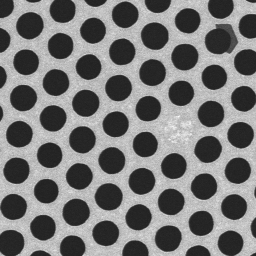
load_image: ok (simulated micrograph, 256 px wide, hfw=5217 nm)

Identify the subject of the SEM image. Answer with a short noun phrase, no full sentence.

a regular array of holes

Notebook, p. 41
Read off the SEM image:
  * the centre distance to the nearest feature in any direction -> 731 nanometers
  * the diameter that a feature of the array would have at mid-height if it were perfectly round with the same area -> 541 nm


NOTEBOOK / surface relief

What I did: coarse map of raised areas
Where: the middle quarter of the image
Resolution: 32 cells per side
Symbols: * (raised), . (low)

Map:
***......**********......***....
***......**********......****..*
***......**********......*******
.***....***.....***......*******
.**********......**......***...*
.*********.......****.*****.....
.****.****.......*********......
***.....***......*********......
**.......**.....***....***......
**.......*********......***.....
**.......*********......****.***
**......**********......********
.**.....***....***......********
.*********......***....*********
**********......****************
**********......****************
**.....***......****************
**......***....***....**********
*.......**********.....*********
*.......*********......*********
**.....**********......*********
**.....***....***......*********
*********......***.....****..***
*********......**********.....**
*********......*********.......*
**....***......*********.......*
*......**.....****...***.......*
*......****.*****.....***.....**
*......*********.......***...***
*......*********.......*********
*.....***....***.......*********
********......***.....***...****